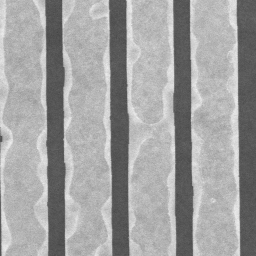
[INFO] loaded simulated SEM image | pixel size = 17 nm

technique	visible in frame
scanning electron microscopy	wiring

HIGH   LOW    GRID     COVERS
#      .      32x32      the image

#####....####...#####...#####...
#####...#####...#####...#####...
#####...######..#####...#####...
######..######..#####...#####...
######..######..#####...######..
######..######..#####...######..
#####...#####....#####..#####...
#####...#####...######..#####...
#####....####...#####...#####...
#####....####...#####...#####...
.####....####...#####...#####...
.####...#####...#####....####...
#####...#####...#####....#####..
######..#####...#####...######..
######...####....####...#####...
######..#####....####...#####...
.#####..#####.....####..#####...
.####...#####....#####...####...
.####...#####....#####...####...
#####....####....#####...#####..
#####....#####..######..######..
#####....#####..######...####...
#####....#####..#####....#####..
######...#####..#####....#####..
#####....#####..#####....#####..
#####....####...#####....#####..
#####....####...#####....#####..
#####....####....####...######..
.#####...#####..######..######..
.#####..######..######..######..
.#####..######...#####..######..
.####...#####....####....#####..